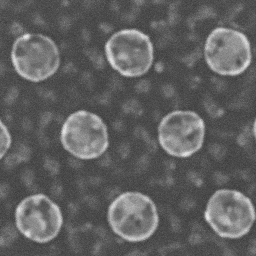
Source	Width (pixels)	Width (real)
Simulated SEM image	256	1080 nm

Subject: a regular array of raised bodies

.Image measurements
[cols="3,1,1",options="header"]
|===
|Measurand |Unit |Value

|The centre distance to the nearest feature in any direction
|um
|0.395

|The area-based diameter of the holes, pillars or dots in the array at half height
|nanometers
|187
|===